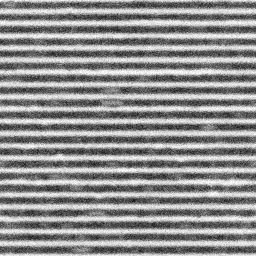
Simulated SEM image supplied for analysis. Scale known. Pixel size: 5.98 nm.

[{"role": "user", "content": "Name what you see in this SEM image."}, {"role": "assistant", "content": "parallel lines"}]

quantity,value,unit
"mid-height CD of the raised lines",0.0269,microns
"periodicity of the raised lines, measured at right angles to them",73.1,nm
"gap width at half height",49.4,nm